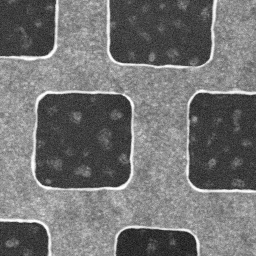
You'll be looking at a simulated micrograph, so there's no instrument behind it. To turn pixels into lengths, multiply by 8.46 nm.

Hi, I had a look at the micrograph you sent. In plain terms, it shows holes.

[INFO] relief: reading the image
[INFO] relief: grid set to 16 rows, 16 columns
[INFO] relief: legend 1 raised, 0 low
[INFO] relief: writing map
0000111000000111
0000111000000111
0001111000000111
0001111000000111
1111111111111111
1111111111111111
1100000011110000
1100000011110000
1100000011110000
1100000011110000
1100000011110000
1110000011110000
1111111111111111
1111111111111111
0001111100001111
0001111000001111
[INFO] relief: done